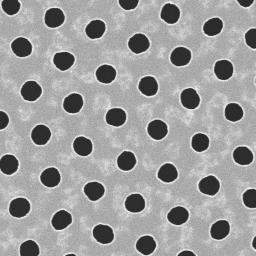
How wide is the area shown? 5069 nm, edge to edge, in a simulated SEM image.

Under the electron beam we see a regular array of holes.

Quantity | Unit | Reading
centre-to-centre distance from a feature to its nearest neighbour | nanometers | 861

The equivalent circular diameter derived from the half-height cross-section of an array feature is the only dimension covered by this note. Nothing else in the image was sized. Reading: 398 nm